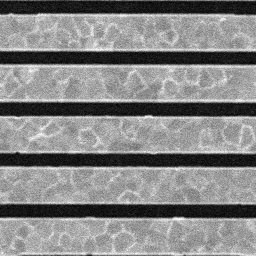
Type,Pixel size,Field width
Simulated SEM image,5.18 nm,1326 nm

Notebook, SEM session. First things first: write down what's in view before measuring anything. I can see parallel lines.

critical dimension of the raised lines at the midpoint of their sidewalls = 187 nm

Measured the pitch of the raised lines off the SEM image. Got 264 nanometers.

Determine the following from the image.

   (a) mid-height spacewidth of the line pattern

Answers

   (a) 15.6 pixels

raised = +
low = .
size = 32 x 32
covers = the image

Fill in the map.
................................
................................
++++++++++++++++++++++++++++++++
++++++++++++++++++++++++++++++++
++++++++++++++++++++++++++++++++
++++++++++++++++++++++++++++++++
................................
................................
++++++++++++++++++++++++++++++++
++++++++++++++++++++++++++++++++
++++++++++++++++++++++++++++++++
++++++++++++++++++++++++++++++++
++++++++++++++++++++++++++++++++
................................
................................
++++++++++++++++++++++++++++++++
++++++++++++++++++++++++++++++++
++++++++++++++++++++++++++++++++
++++++++++++++++++++++++++++++++
................................
................................
++++++++++++++++++++++++++++++++
++++++++++++++++++++++++++++++++
++++++++++++++++++++++++++++++++
++++++++++++++++++++++++++++++++
................................
................................
++++++++++++++++++++++++++++++++
++++++++++++++++++++++++++++++++
++++++++++++++++++++++++++++++++
++++++++++++++++++++++++++++++++
++++++++++++++++++++++++++++++++